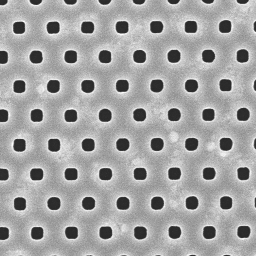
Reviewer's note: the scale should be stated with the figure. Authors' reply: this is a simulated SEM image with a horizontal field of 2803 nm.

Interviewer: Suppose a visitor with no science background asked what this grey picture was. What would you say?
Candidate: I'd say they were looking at a regular array of holes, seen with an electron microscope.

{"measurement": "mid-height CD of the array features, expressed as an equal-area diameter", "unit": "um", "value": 0.152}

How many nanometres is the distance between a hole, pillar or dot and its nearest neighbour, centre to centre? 370